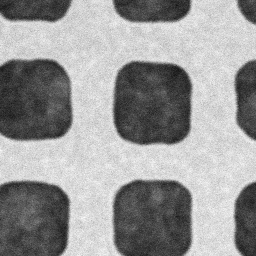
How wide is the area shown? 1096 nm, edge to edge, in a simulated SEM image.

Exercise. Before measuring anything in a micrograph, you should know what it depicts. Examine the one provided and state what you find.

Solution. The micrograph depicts holes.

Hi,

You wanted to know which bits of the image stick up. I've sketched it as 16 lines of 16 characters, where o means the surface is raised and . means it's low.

....ooo.....ooo.
oooooooooooooooo
oooooooooooooooo
oooooooooooooooo
....ooo.....ooo.
....ooo.....ooo.
....ooo.....ooo.
.....oo.....ooo.
....oooo....oooo
oooooooooooooooo
oooooooooooooooo
...ooooo...ooooo
....ooo.....ooo.
....ooo.....ooo.
....ooo.....ooo.
....ooo.....ooo.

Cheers